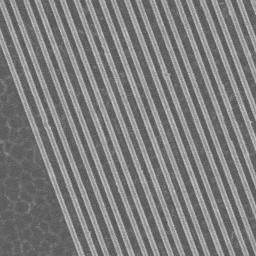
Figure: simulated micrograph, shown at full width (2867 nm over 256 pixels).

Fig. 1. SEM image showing parallel lines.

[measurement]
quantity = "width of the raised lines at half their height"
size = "42 nm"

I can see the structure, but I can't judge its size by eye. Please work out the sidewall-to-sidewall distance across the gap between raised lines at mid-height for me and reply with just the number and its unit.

8.44 pixels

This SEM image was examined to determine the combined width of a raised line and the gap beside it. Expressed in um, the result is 0.133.